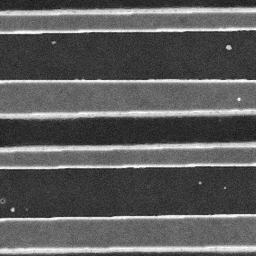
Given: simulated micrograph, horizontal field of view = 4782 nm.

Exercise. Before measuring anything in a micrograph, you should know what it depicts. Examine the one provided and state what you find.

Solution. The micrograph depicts lines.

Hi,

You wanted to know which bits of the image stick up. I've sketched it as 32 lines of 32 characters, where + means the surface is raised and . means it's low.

................................
....................++++++++++++
++++++++++++++++++++++++++++++++
++++++++++++++++++++++++++++++++
................................
................................
................................
................................
................................
................................
++++++++++++++++++++++++++++++++
++++++++++++++++++++++++++++++++
++++++++++++++++++++++++++++++++
++++++++++++++++++++++++++++++++
................................
................................
................................
................................
..................++++++++++++++
++++++++++++++++++++++++++++++++
++++++++++++++++++++++++++++++++
................................
................................
................................
................................
................................
................................
++++++++++++++++++++++++++++++++
++++++++++++++++++++++++++++++++
++++++++++++++++++++++++++++++++
++++++++++++++++++++++++++++++++
................................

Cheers